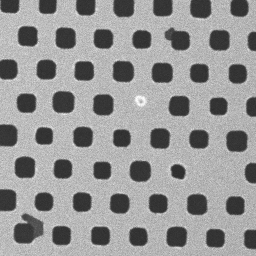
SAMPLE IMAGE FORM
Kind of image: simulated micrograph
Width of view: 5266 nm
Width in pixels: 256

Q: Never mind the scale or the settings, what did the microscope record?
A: a regular array of holes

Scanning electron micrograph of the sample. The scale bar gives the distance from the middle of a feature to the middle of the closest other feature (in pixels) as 37.4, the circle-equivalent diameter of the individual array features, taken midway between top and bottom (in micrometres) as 0.44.